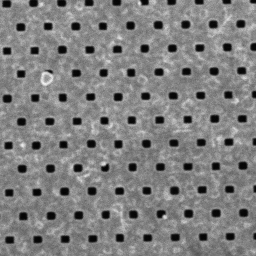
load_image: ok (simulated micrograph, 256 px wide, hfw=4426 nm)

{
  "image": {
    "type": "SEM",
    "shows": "a regular array of holes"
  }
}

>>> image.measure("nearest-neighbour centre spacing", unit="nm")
466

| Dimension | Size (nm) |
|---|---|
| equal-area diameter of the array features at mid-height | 166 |